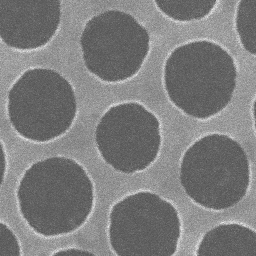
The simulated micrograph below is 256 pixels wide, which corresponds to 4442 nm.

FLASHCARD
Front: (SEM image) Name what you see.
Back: holes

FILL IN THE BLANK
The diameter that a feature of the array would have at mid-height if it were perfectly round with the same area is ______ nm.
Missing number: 1250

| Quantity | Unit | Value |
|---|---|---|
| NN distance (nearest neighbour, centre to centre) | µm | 1.6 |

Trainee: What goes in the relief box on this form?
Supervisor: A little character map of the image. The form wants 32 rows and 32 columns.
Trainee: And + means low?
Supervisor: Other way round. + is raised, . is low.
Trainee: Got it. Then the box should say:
........++++++++++++.......+++..
........+++++..+++++......++++..
........+++......+++++..+++++...
.......++++.......++++++++++++..
.......+++.........+++++++++++..
+.....++++.........++++....+++..
++++++++++.........+++......+++.
++++++++++........+++........+++
+++++++++++.......+++........+++
+++.....++++.....++++.........++
++.......++++++++++++.........++
+........++++++++++++........+++
+........++++++++++++........+++
+.........++++....++++......++++
+........++++......+++++..++++++
+........+++........++++++++++++
++......++++........++++++++++++
++++..++++++........+++++....+++
++++++++++++........++++......++
.++++++++++++.......+++........+
.+++......++++.....++++........+
.++........++++..+++++.........+
+++........+++++++++++.........+
++..........+++++++++++........+
++..........++++....++++.......+
++..........++.......++++....+++
+++........+++........++++++++++
+++......+.+++........++++++++++
.+++.....+++++.........++++....+
..++++.+++++++........+++.......
..++++++++++++........+++.......
...++++....+++........+++.......